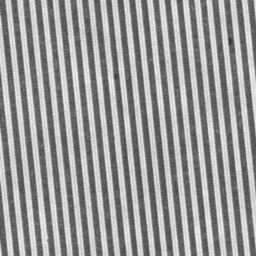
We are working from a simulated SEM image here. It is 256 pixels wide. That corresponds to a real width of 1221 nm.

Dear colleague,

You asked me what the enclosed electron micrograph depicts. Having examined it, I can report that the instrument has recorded parallel lines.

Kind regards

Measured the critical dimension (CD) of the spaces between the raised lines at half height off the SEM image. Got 37.3 nm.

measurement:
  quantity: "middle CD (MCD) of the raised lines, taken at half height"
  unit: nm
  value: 19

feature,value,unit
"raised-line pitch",56.1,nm